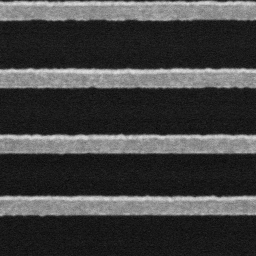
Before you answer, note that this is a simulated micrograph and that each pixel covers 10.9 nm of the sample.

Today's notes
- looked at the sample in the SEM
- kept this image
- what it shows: lines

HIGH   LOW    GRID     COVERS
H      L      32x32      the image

HHHHHHHHHHHHHHHHHHHHHHHHHHHHHHHH
HHHHHHHHHHHHHHHHHHHHHHHHHHHHHHHH
LLLLLLLLLLLLLLLLLLLLLLLLLLLLLLLL
LLLLLLLLLLLLLLLLLLLLLLLLLLLLLLLL
LLLLLLLLLLLLLLLLLLLLLLLLLLLLLLLL
LLLLLLLLLLLLLLLLLLLLLLLLLLLLLLLL
LLLLLLLLLLLLLLLLLLLLLLLLLLLLLLLL
LLLLLLLLLLLLLLLLLLLLLLLLLLLLLLLL
LLLLLLLLLLLLLLLLLLLLLLLLLLLLLLLL
HHHHHHHHHHHHHHHHHHHHHHHHHHHHHHHH
HHHHHHHHHHHHHHHHHHHHHHHHHHHHHHHH
LLLLLLLLLLLLLLLLLLLLLLLLLLLLLLLL
LLLLLLLLLLLLLLLLLLLLLLLLLLLLLLLL
LLLLLLLLLLLLLLLLLLLLLLLLLLLLLLLL
LLLLLLLLLLLLLLLLLLLLLLLLLLLLLLLL
LLLLLLLLLLLLLLLLLLLLLLLLLLLLLLLL
LLLLLLLLLLLLLLLLLLLLLLLLLLLLLLLL
HHHHHHHHHHHHHHHHHHHHHHHHHHHHHHHH
HHHHHHHHHHHHHHHHHHHHHHHHHHHHHHHH
LLLLLLLLLLLLLLLLLLLLLLLLLLLLLLLL
LLLLLLLLLLLLLLLLLLLLLLLLLLLLLLLL
LLLLLLLLLLLLLLLLLLLLLLLLLLLLLLLL
LLLLLLLLLLLLLLLLLLLLLLLLLLLLLLLL
LLLLLLLLLLLLLLLLLLLLLLLLLLLLLLLL
LLLLLLLLLLLLLLLLLLLLLLLLLLLLLLLL
HHHHHHHHHHHHHHHHHHHHHHHHHHHHHHHH
HHHHHHHHHHHHHHHHHHHHHHHHHHHHHHHH
LLLLLLLLLLLLLLLLLLLLLLLLLLLLLLLL
LLLLLLLLLLLLLLLLLLLLLLLLLLLLLLLL
LLLLLLLLLLLLLLLLLLLLLLLLLLLLLLLL
LLLLLLLLLLLLLLLLLLLLLLLLLLLLLLLL
LLLLLLLLLLLLLLLLLLLLLLLLLLLLLLLL